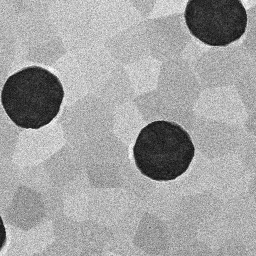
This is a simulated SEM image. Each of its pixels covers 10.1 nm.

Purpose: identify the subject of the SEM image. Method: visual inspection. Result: holes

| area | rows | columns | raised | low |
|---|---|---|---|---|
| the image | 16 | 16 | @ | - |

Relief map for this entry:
@@@@@@@@@@@@---@
@@@@@@@@@@@@---@
@@@@@@@@@@@@@--@
@@@@@@@@@@@@@@@@
@--@@@@@@@@@@@@@
----@@@@@@@@@@@@
----@@@@@@@@@@@@
@--@@@@@@@@@@@@@
@@@@@@@@@---@@@@
@@@@@@@@----@@@@
@@@@@@@@@---@@@@
@@@@@@@@@@@@@@@@
@@@@@@@@@@@@@@@@
@@@@@@@@@@@@@@@@
@@@@@@@@@@@@@@@@
@@@@@@@@@@@@@@@@